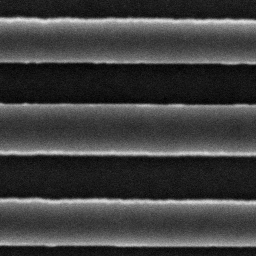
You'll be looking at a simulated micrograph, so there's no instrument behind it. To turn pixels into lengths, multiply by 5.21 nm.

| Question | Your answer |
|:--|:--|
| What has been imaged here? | lines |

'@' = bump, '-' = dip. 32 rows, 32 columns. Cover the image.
--------------------------------
--------------------------------
-@@----@@-----------------------
@@@@@@@@@@@@@@@@@@@@@@@@@@@@@@@@
@@@@@@@@@@@@@@@@@@@@@@@@@@@@@@@@
@@@@@@@@@@@@@@@@@@@@@@@@@@@@@@@@
@@@@@@@@@@@@@@@@@@@@@@@@@@@@@@@@
@@@@@@@@@@@@@@@@@@@@@@@@@@@@@@@@
--------------------------------
--------------------------------
--------------------------------
--------------------------------
--------------------------------
@@@@@@@@@@@@@@@@@@@@@@@@@@@@@@@@
@@@@@@@@@@@@@@@@@@@@@@@@@@@@@@@@
@@@@@@@@@@@@@@@@@@@@@@@@@@@@@@@@
@@@@@@@@@@@@@@@@@@@@@@@@@@@@@@@@
@@@@@@@@@@@@@@@@@@@@@@@@@@@@@@@@
@@@@@@@@@@@@@@@@@@@@@@@@@@@@@@@@
--------------------------------
--------------------------------
--------------------------------
--------------------------------
--------------------------------
--------------------------------
@@@@@@@@@@@@@@@@@@@@@@@@@@@@@@@@
@@@@@@@@@@@@@@@@@@@@@@@@@@@@@@@@
@@@@@@@@@@@@@@@@@@@@@@@@@@@@@@@@
@@@@@@@@@@@@@@@@@@@@@@@@@@@@@@@@
@@@@@@@@@@@@@@@@@@@@@@@@@@@@@@@@
@@@@@@@@@@@@@@@@@@@@@@@@@@@@@@@@
--------------------------------